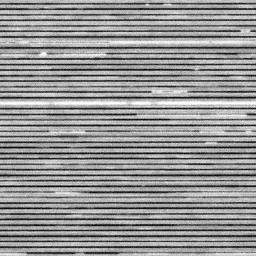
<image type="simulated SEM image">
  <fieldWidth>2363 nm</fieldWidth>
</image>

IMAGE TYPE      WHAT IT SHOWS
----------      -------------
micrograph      parallel lines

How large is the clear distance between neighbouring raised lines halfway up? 18.5 nm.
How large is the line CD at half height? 0.0369 microns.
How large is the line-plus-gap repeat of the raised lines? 51.1 nanometers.